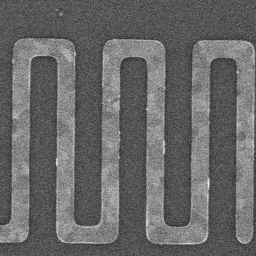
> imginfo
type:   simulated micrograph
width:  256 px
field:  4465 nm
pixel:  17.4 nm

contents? groups of lines, slits or small figures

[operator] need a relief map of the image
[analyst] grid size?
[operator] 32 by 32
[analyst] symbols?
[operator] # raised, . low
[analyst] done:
................................
................................
................................
................................
................................
..#######....#######.....######.
..#######....########...########
..##...##....##...###...###..###
..##...##....##....##...##....##
..##...##....##....##...##....##
..##...##....##....##...##....##
..##...##....##....##...##....##
..##...##....##...###...##....##
..##...##....##...##....##....##
..##...##....##...##....##....##
..##...##....##...##....##....##
..##...##....##...##....##....##
..##...##....##...##....##....##
..##...##....##...##....##....##
..#....##....##...##....##....##
..#....##....##...##....##....##
..##...##....##...##....##....##
..##...##....##...##....##....##
..##...##....##...##....##....##
..#....##....##...##....##....##
..#....##....##...##....##....##
..#....##....##...##....##....##
.##....##....##...##....##....##
###....########...########....##
###....########...########....#.
................................
................................